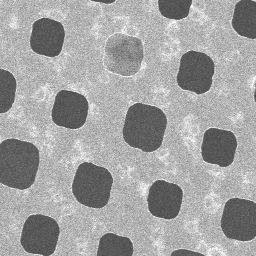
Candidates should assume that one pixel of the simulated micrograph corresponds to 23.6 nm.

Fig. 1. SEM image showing holes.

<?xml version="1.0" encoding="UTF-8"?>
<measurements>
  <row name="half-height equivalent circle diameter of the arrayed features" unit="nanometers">910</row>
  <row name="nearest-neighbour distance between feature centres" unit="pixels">75.1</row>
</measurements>